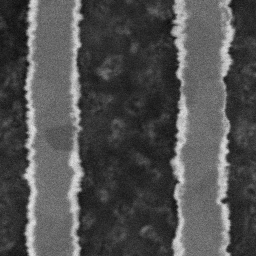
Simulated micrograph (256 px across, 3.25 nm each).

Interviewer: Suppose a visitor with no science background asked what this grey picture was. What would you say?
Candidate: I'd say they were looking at one or a few lines or trenches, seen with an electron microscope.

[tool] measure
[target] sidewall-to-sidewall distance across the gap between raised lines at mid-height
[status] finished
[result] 0.341 microns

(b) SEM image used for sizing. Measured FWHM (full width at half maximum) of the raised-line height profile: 0.147 microns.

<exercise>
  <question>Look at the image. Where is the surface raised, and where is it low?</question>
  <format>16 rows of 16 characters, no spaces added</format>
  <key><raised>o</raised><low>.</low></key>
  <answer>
..ooo......ooo..
..ooo......ooo..
..ooo......ooo..
..ooo......ooo..
..ooo......ooo..
..ooo......ooo..
..ooo......ooo..
..ooo......ooo..
..ooo......ooo..
..ooo......ooo..
..ooo......ooo..
..ooo......ooo..
..ooo......ooo..
..ooo......ooo..
..ooo......ooo..
..ooo......ooo..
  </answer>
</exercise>